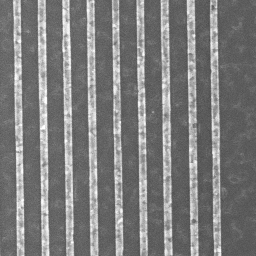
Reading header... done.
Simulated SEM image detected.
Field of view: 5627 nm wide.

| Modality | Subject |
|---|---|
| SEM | parallel lines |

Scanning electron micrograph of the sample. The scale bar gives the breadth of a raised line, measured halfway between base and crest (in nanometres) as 129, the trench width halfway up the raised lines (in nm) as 406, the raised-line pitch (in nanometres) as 540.